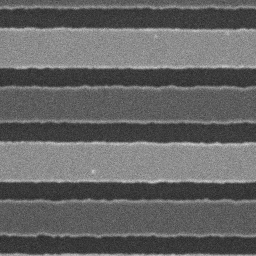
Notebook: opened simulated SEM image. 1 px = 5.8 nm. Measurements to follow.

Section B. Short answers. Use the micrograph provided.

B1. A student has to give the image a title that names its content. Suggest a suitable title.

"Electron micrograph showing lines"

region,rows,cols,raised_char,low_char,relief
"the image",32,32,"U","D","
UUUUUUUUUUUUUUUUUUUUUUUUUUUUUUUU
DDDDDDDDDDDDDDDDDDDDDDDDDDDDDDDD
DDDDDDDDDDDDDDDDDDDDDDDDDDDDDDDD
DDDDDDDDDDDDDDDDDDDDDDDDDDDDDDDD
UUUUUUUUUUUUUUUUUUUUUUUUUUUUUUUU
UUUUUUUUUUUUUUUUUUUUUUUUUUUUUUUU
UUUUUUUUUUUUUUUUUUUUUUUUUUUUUUUU
UUUUUUUUUUUUUUUUUUUUUUUUUUUUUUUU
DUUUUUDUDDDUUUUUUUUUUUUUDDUDDUDU
DDDDDDDDDDDDDDDDDDDDDDDDDDDDDDDD
DDDDDDDDDDDDDDDDDDDDDDDDDDDDDDDD
UUUUUUUUUUUUUUUUUUUUUUUUUUUUUUUU
UUUUUUUUUUUUUUUUUUUUUUUUUUUUUUUU
UUUUUUUUUUUUUUUUUUUUUUUUUUUUUUUU
UUUUUUUUUUUUUUUUUUUUUUUUUUUUUUUU
DDDDDDDDDDDDDDDDDDDDDDDDDDDDDDDD
DDDDDDDDDDDDDDDDDDDDDDDDDDDDDDDD
DDDDDDDDDDDDDDDDDDDDDDDDDDDDDDDD
UUUUUUUUUUUUUUUUUUUUUUUUUUUUUUUU
UUUUUUUUUUUUUUUUUUUUUUUUUUUUUUUU
UUUUUUUUUUUUUUUUUUUUUUUUUUUUUUUU
UUUUUUUUUUUUUUUUUUUUUUUUUUUUUUUU
UUUUUUUUUUUUUUUUUUUUUUUUUUUUUUUU
DDDDDDDDDDDDDDDDDDDDDDDDDDDDDDDD
DDDDDDDDDDDDDDDDDDDDDDDDDDDDDDDD
UUUUUUUUUUUUUUUUUUUUUUUUUUUUUUUU
UUUUUUUUUUUUUUUUUUUUUUUUUUUUUUUU
UUUUUUUUUUUUUUUUUUUUUUUUUUUUUUUU
UUUUUUUUUUUUUUUUUUUUUUUUUUUUUUUU
DDDDDDDUDUDUUDDUDDDDUUDDUUDDDDUU
DDDDDDDDDDDDDDDDDDDDDDDDDDDDDDDD
DDDDDDDDDDDDDDDDDDDDDDDDDDDDDDDD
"